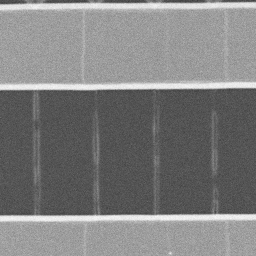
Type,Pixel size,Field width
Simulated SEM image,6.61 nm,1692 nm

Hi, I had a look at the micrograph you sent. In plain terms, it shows wiring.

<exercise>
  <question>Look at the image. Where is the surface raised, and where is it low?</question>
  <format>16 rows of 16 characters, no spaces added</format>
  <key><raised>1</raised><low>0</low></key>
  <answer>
1111111111111111
1111111111111111
1111111111111111
1111111111111111
1111111111111111
0000000000000000
0000000000000000
0000000000000000
0000000000000000
0000000000000000
0000000000000000
0000000000000000
0000000000000000
0000000000000000
1111111111111111
1111111111111111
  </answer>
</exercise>